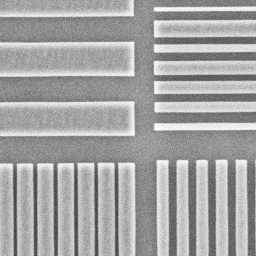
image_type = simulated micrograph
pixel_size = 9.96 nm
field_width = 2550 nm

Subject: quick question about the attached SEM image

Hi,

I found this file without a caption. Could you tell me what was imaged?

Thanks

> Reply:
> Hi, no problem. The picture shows groups of lines, slits or small figures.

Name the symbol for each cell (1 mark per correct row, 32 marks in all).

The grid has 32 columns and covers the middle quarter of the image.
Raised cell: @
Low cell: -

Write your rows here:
@@@@@@@@@@@@@@@@@------@@@@@@@@@
@@@@@@@@@@@@@@@@@------@@@@@@@@@
@@@@@@@@@@@@@@@@@------@@@------
--------------------------------
-----------------------@@@@@@@@@
-----------------------@@@@@@@@@
-----------------------@@@@@@@@@
--------------------------------
--------------------------------
--------------------------------
@@@@@@@@@@@@@@@@@------@@@@@@@@@
@@@@@@@@@@@@@@@@@------@@@@@@@@@
@@@@@@@@@@@@@@@@@---------------
@@@@@@@@@@@@@@@@@---------------
@@@@@@@@@@@@@@@@@---------------
@@@@@@@@@@@@@@@@@------@@@@@@@@@
@@@@@@@@@@@@@@@@@------@--------
@@@@@@@@@@@@@@@@@---------------
--------------------------------
--------------------------------
--------------------------------
--------------------------------
--------------------------------
--------------------------------
-----------------------@@@--@@@-
@@--@@@--@@@--@@@------@@@--@@@-
@@--@@@--@@@--@@@@-----@@@--@@@-
@@--@@@--@@@--@@@@-----@@@--@@@-
@@--@@@--@@@@-@@@@-----@@@--@@@-
@@--@@@--@@@@-@@@@-----@@@--@@@-
@@--@@@--@@@@-@@@@-----@@@--@@@-
@@--@@@--@@@@-@@@@-----@@@--@@@-